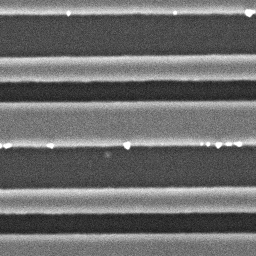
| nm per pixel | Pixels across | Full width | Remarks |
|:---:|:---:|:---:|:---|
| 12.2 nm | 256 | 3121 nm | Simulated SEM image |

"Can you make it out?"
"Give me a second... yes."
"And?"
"lines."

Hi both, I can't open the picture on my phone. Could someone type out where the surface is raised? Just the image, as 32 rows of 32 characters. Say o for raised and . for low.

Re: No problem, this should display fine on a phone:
oooooooooooooooooooooooooooooooo
ooooooooooooo........o........oo
................................
................................
................................
................................
................................
oooooooooooooooooooooooooooooooo
oooooooooooooooooooooooooooooooo
oooooooooooooooooooooooooooooooo
................................
................................
................................
oooooooooooooooooooooooooooooooo
oooooooooooooooooooooooooooooooo
oooooooooooooooooooooooooooooooo
oooooooooooooooooooooooooooooooo
oooooooooooooooooooooooooooooooo
................................
................................
................................
................................
................................
................................
oooooooooooooooooooooooooooooooo
oooooooooooooooooooooooooooooooo
oooooooooooooooooooooooo........
................................
................................
oooooooooooooooooooooooooooooooo
oooooooooooooooooooooooooooooooo
oooooooooooooooooooooooooooooooo